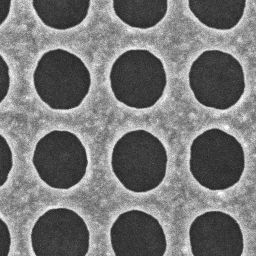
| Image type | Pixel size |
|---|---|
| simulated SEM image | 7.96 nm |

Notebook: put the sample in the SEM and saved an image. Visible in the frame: holes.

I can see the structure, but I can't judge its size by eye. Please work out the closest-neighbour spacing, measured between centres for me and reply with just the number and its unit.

615 nanometres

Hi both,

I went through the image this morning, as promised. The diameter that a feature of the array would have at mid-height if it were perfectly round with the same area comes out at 464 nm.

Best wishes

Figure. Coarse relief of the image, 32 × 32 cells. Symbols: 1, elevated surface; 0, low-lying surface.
01110000000111000000011100000001
01111000000111000000011100000011
01111000001111100000111110000011
11111110011111111001111111000111
11111111111111111111111111111111
11111111111111111111111111111111
11111100011111110001111111001111
01111000001111100000111100000011
01110000000111000000111100000011
01110000000111000000011100000011
01110000000111000000011100000001
01111000000111000000111100000011
11111000001111100000111110000011
11111100011111111011111111100111
11111111111111111111111111111111
11111111111111111111111111111111
11111100011111110001111111001111
01111000001111100000111100000011
01110000000111000000011100000011
00110000000111000000011100000001
00110000000111000000011100000001
01111000000111000000011100000011
01111000001111100000111100000011
11111110011111110001111111001111
11111111111111111111111111111111
11111111111111111111111111111111
11111100011111110011111111001111
11111000001111000000111100000111
01110000000111000000111100000011
01110000000111000000011100000011
01110000000111000000011100000011
01110000000111000000011100000011